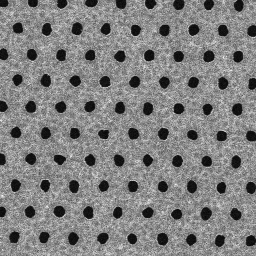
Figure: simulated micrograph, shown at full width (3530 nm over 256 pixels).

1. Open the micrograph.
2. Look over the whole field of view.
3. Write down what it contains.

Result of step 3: a regular array of holes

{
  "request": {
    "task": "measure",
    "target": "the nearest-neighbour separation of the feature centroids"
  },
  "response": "400 nm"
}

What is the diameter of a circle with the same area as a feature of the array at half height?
152 nm